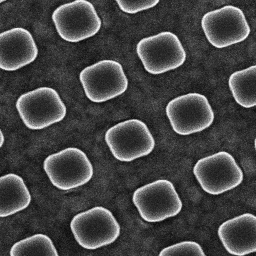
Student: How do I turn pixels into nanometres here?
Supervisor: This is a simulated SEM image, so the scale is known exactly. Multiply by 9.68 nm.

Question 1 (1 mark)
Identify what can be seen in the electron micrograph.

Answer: a regular array of raised bodies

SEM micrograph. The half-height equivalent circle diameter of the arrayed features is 406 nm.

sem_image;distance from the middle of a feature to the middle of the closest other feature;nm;633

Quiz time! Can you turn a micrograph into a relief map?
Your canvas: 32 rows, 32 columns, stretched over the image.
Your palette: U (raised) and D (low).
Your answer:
DDDDDDDDDUUDDDDUUUUDDDDDDDDDDDDD
DDDDDDDUUUUUDDDDUDDDDDDDDDDUUUDD
DDDDDDDUUUUUDDDDDDDDDDDDDUUUUUUD
DDDDDDDUUUUUDDDDDDDDDDDDDDUUUUUD
UUUUDDDDUUUDDDDDDDDUUUDDDDUUUUUD
UUUUDDDDDDDDDDDDDUUUUUDDDDDUUDDD
UUUUDDDDDDDDDDDDDUUUUUUDDDDDDDDD
UUUUDDDDDDDDDDDDDDUUUUUDDDDDDDDD
UUDDDDDDDDDUUUUDDDUUUUDDDDDDDDDU
DDDDDDDDDDUUUUUUDDDDDDDDDDDDDUUU
DDDDDDDDDDUUUUUUDDDDDDDDDDDDDUUU
DDDDUUUDDDDUUUUDDDDDDDDDDDDDDUUU
DDUUUUUDDDDDUDDDDDDDDDUUUUDDDDUU
DDUUUUUUDDDDDDDDDDDDDUUUUUDDDDDD
DDDUUUUUDDDDDDDDDDDDDUUUUUUDDDDD
DDDUUUDDDDDDDDDUUUDDDDUUUUDDDDDD
DDDDDDDDDDDDDDUUUUUDDDUUDDDDDDDD
DDDDDDDDDDDDDUUUUUUDDDDDDDDDDDDD
DDDDDDDDDDDDDDUUUUUDDDDDDDDDDDDD
DDDDDDUUUUUDDDUUUDDDDDDDDDUUUDDD
DDDDDDUUUUUDDDDDDDDDDDDDDUUUUDDD
DDDDDDUUUUUDDDDDDDDDDDDDUUUUUUDD
UUUDDDUUUUUDDDDDDDDDDDDDDUUUUUDD
UUUDDDDDUDDDDDDDDDUUUUDDDUUUUDDD
UUUUDDDDDDDDDDDDDUUUUUDDDDDDDDDD
UUUDDDDDDDDDDDDDDUUUUUUDDDDDDDDD
UUDDDDDDDDDUUDDDDDUUUUDDDDDDDDDD
DDDDDDDDDUUUUUDDDDUUDDDDDDDDDUUU
DDDDDDDDDUUUUUUDDDDDDDDDDDDDUUUU
DDDDUUDDDUUUUUUDDDDDDDDDDDDDUUUU
DDUUUUDDDDUUUDDDDDDDDDUUDDDDUUUU
DUUUUUUDDDDDDDDDDDDDUUUUUDDDDUUD